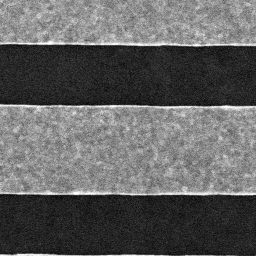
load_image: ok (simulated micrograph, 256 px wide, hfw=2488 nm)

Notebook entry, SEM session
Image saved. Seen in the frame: wiring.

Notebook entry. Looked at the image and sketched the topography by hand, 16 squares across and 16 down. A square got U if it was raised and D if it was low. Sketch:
UUUUUUUUUUUUUUUU
UUUUUUUUUUUUUUUU
UUUUUUUUUUUUUUUU
DDDDDDDDDDDDDDDD
DDDDDDDDDDDDDDDD
DDDDDDDDDDDDDDDD
DDDDDDDDDDDDDDDD
UUUUUUUUUUUUUUUU
UUUUUUUUUUUUUUUU
UUUUUUUUUUUUUUUU
UUUUUUUUUUUUUUUU
UUUUUUUUUUUUUUUU
DDDDDDDDDDDDDDDD
DDDDDDDDDDDDDDDD
DDDDDDDDDDDDDDDD
DDDDDDDDDDDDDDDD